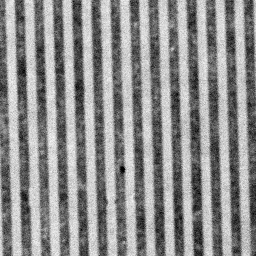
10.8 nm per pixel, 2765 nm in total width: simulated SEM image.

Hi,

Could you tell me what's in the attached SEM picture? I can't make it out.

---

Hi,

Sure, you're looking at parallel lines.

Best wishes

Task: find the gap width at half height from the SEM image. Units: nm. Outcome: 119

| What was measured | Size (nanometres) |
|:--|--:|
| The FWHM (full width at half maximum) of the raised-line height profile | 90.4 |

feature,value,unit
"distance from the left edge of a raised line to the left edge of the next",0.206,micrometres